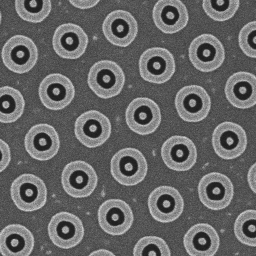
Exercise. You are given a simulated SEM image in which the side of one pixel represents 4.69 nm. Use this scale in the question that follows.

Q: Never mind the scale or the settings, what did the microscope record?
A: a regular array of ring-shaped raised bodies with a dot in the middle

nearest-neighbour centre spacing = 0.241 micrometres